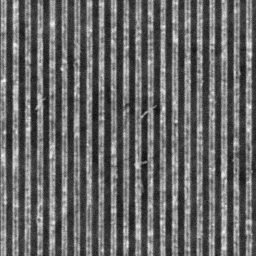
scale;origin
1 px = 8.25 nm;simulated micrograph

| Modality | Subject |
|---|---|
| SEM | parallel lines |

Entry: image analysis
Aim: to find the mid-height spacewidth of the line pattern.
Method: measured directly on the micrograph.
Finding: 67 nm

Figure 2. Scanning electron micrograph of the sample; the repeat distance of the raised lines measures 0.101 µm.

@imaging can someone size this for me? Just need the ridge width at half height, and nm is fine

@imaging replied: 36.1